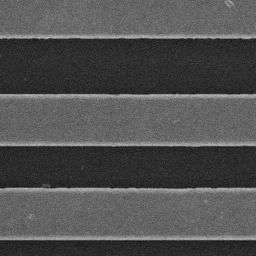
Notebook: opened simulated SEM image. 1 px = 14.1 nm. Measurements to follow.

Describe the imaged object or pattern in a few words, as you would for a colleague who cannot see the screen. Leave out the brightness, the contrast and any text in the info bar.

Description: lines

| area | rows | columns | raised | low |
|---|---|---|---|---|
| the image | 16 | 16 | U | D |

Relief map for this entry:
UUUUUUUUUUUUUUUU
UUUUUUUUUUUUUUUU
DDDDDDDDDDDDDDDD
DDDDDDDDDDDDDDDD
DDDDDDDDDDDDDDDD
DDDDDDDDDDDDDDDD
UUUUUUUUUUUUUUUU
UUUUUUUUUUUUUUUU
UUUUUUUUUUUUUUUU
DDDDDDDDDDDDDDDD
DDDDDDDDDDDDDDDD
DDDDDDDDDDDDDDDD
UUUUUUUUUUUUUUUU
UUUUUUUUUUUUUUUU
UUUUUUUUUUUUUUUU
DDDDDDDDDDDDDDDD